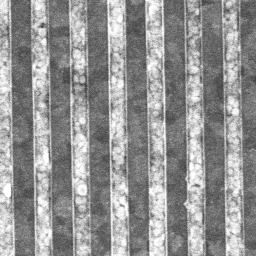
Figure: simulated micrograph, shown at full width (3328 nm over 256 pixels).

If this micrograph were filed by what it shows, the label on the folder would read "parallel lines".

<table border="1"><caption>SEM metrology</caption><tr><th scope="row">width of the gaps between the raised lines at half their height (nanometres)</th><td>213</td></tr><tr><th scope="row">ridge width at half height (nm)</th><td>284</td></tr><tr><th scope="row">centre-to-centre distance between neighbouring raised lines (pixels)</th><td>38.3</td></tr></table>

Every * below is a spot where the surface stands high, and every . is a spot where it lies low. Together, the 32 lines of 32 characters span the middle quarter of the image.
**....*****....******....******.
**....*****....******....******.
**....*****.....*****....******.
**..*.*****.*...*****....******.
**....*****.*.*.*****....******.
**....*****.....*****....******.
**....*****.....*****....******.
**....*****.....*****....******.
**....*****.....*****....******.
**....*****.....*****....******.
**....*****.....*****....******.
**....*****.....*****....******.
**....*****.....*****....******.
**....*****.....*****....******.
**....*****.....*****....******.
**....*****.....*****....******.
**....*****.....*****....******.
**....*****.....*****....******.
**....*****.....*****....******.
**....*****.....*****....******.
**....*****.....*****....******.
**....*****.....*****....******.
**....******....*****....******.
**....*********.*****....******.
**....******.**.*****....******.
**....******....*****....*******
**....******....*****....******.
**....******....*****....******.
**....******....*****.....*****.
**....******....*****.....*****.
**..*.******....*****.....*****.
**..********....*****.....*****.